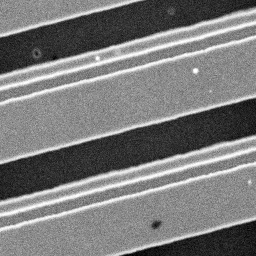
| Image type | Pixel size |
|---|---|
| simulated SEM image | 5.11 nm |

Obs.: lines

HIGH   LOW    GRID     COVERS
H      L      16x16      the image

HHHHHHHLLLLLLLLL
HHHLLLLLLLLLLHHH
LLLLLLLLLHHHHHHH
LLLLLHHHHHHHHHHH
LHHHHHHHHHHHHHHH
HHHHHHHHHHHHHHHH
HHHHHHHHHHHHHHLL
HHHHHHHHHHHLLLLL
HHHHHHHLLLLLLLLL
HHHLLLLLLLLLHHHH
LLLLLLLLHHHHHHHH
LLLLLHHHHHHHHHHH
LHHHHHHHHHHHHHHH
HHHHHHHHHHHHHHHH
HHHHHHHHHHHHHLLL
HHHHHHHHHLLLLLLL